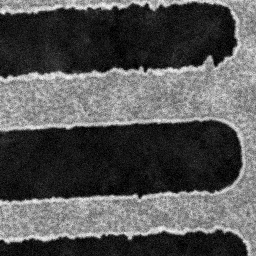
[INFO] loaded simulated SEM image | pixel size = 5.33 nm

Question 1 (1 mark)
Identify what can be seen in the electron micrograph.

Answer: one or a few lines or trenches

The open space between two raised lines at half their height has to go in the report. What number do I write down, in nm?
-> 377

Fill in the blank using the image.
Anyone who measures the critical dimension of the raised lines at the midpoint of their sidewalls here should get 0.254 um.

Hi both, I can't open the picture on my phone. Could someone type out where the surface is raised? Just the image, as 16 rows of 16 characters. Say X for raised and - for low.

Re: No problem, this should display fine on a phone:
XXX-----------XX
---------------X
---------------X
--------------XX
-------XXXXXXXXX
XXXXXXXXXXXXXXXX
XXXXXXXXXXXXXXXX
XXXXXXXXXXXX--XX
---------------X
---------------X
---------------X
---------------X
---XXXXXXXXXXXXX
XXXXXXXXXXXXXXXX
XXXXXXXXX------X
----------------